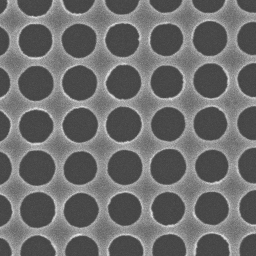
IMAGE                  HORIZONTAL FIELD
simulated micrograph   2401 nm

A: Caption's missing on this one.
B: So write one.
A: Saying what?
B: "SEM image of a regular array of holes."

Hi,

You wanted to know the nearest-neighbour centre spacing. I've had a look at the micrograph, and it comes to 397 nm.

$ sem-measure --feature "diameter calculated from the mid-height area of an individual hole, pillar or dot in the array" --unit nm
324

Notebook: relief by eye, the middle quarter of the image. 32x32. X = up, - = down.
XXX--XXXXXXXX----XXXXXXX---XXXXX
X------XXXXX------XXXXX------XXX
--------XXX--------XXX-------XXX
--------XXX--------XXX--------XX
--------XX---------XX---------XX
--------XXX--------XXX--------XX
--------XXX--------XXX-------XXX
X------XXXXX------XXXXX------XXX
XX----XXXXXXX----XXXXXXXX-XXXXXX
XXXXXXXXXXXXXXXXXXXXXXXXXXXXXXXX
XXXXXXXXXXXXXXXXXXXXXXXXXXXXXXXX
XX----XXXXXXX-----XXXXX------XXX
X------XXXX--------XXXX-------XX
--------XXX--------XXX--------XX
--------XX---------XXX--------XX
--------XX---------XXX--------XX
--------XXX--------XXX--------XX
--------XXX--------XXX--------XX
X------XXXXX------XXXXX------XXX
XXX--XXXXXXXX--XXXXXXXXXXXXXXXXX
XXXXXXXXXXXXXXXXXXXXXXXXXXXXXXXX
XXXXXXXXXXXXXX--XXXXXXXXX---XXXX
XX-----XXXXX------XXXXX------XXX
X-------XXX--------XXX--------XX
--------XXX--------XXX--------XX
--------XXX---------X----------X
--------XXX---------X---------XX
--------XXX--------XXX--------XX
--------XXXX-------XXX--------XX
XX----XXXXXXX-----XXXXX-----XXXX
XXXXXXXXXXXXXXXXXXXXXXXXXXXXXXXX
XXXXXXXXXXXXXXXXXXXXXXXXXXXXXXXX